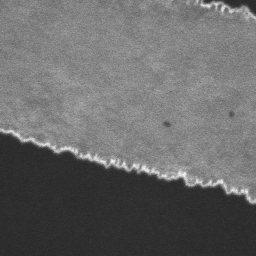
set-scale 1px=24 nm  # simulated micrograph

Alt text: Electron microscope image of one or a few lines or trenches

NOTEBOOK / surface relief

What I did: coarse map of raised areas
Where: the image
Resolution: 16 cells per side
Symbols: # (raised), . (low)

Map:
..............##
................
................
................
................
................
................
................
#...............
#####...........
#########.......
##############..
################
################
################
################